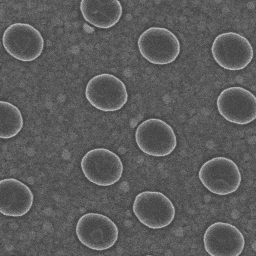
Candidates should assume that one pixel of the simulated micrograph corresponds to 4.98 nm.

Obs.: a regular array of raised bodies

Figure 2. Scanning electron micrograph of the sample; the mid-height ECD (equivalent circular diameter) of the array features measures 192 nm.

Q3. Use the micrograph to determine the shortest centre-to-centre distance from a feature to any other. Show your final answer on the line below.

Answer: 333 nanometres